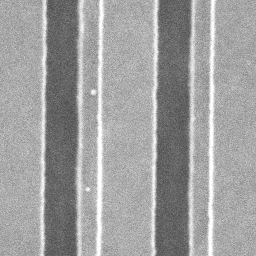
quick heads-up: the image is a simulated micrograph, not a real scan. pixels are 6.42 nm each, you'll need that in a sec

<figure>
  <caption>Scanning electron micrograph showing lines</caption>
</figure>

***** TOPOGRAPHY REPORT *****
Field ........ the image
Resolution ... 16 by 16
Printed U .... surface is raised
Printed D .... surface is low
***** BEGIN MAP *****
UUUDDUUUUUDDUUUU
UUUDDUUUUUDDUUUU
UUUDDUUUUUDDUUUU
UUUDDUUUUUDDUUUU
UUUDDUUUUUDDUUUU
UUUDDUUUUUDDUUUU
UUUDDUUUUUDDUUUU
UUUDDUUUUUDDUUUU
UUUDDUUUUUDDUUUU
UUUDDUUUUUDDUUUU
UUUDDUUUUUDDUUUU
UUUDDUUUUUDDUUUU
UUUDDUUUUUDDUUUU
UUUDDUUUUUDDUUUU
UUUDDUUUUUDDUUUU
UUUDDUUUUUDDUUUU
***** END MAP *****